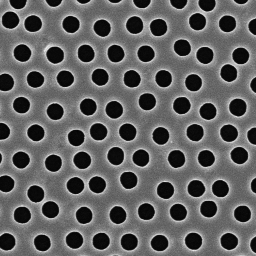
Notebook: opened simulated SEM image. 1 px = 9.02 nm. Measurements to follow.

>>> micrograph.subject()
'a regular array of holes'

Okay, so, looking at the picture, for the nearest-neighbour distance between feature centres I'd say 236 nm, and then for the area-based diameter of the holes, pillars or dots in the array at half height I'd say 0.156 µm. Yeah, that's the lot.